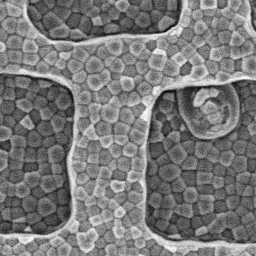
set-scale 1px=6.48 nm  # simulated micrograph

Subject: holes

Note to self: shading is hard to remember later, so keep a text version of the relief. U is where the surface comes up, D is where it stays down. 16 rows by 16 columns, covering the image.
UUDDDDDDDDDUUUUU
UUDDDDDDDDDUUUUU
UUUDDDUUUUUUUUUU
UUUUUUUUUUUUUUUU
UUUUUUUUUUUUUUUU
DDDDUUUUUUUDDDDD
DDDDDUUUUUDDDDDD
DDDDDUUUUDDDDDDD
DDDDDUUUUDDDDDDD
DDDDUUUUUDDDDDDD
DDDDUUUUUDDDDDDD
DDDDUUUUUDDDDDDD
DDDDDUUUUDDDDDDD
DDDDUUUUUDDDDDDD
DDDUUUUUUUDDDDDD
UUUUUUUUUUUUUUUU